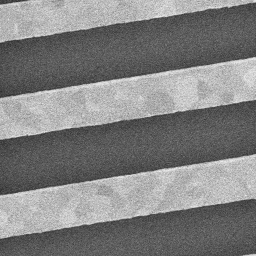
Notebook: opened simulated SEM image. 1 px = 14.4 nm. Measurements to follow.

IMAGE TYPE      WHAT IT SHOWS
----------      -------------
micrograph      lines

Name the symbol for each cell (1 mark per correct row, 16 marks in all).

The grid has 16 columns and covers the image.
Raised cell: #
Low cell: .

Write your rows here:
##############..
#######.........
#...............
................
..........######
....############
##############..
########........
#...............
................
...........#####
.....###########
###############.
#########.......
##..............
................